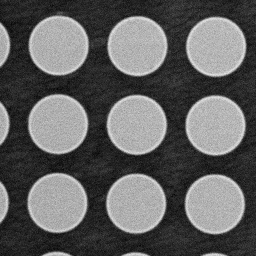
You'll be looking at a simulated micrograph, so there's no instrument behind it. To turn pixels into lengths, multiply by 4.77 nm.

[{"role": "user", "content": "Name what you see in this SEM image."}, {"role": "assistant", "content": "an array of small figures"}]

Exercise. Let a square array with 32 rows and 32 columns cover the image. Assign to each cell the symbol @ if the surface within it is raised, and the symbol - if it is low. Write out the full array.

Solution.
--------------------------------
--------------------------------
------@@@------@@@@-------@@@---
@---@@@@@@----@@@@@@----@@@@@@--
@---@@@@@@@---@@@@@@@---@@@@@@--
@---@@@@@@@---@@@@@@@--@@@@@@@@-
@---@@@@@@@---@@@@@@@--@@@@@@@@-
@---@@@@@@@---@@@@@@----@@@@@@--
-----@@@@@-----@@@@@----@@@@@@--
--------------------------------
--------------------------------
--------------------------------
-----@@@@------@@@@------@@@@---
@---@@@@@@----@@@@@@----@@@@@@--
@---@@@@@@@---@@@@@@@--@@@@@@@--
@---@@@@@@@--@@@@@@@@--@@@@@@@@-
@---@@@@@@@---@@@@@@@--@@@@@@@@-
----@@@@@@----@@@@@@----@@@@@@--
-----@@@@------@@@@------@@@@---
--------------------------------
--------------------------------
--------------------------------
-----@@@@------@@@@------@@@@---
@---@@@@@@----@@@@@@----@@@@@@--
@---@@@@@@@--@@@@@@@@--@@@@@@@--
@---@@@@@@@--@@@@@@@@--@@@@@@@@-
@---@@@@@@@--@@@@@@@@--@@@@@@@--
----@@@@@@----@@@@@@----@@@@@@--
-----@@@@------@@@@------@@@@---
--------------------------------
--------------------------------
--------------------------------